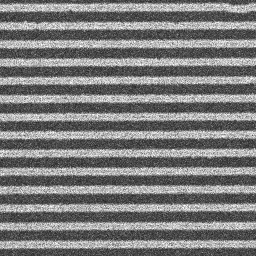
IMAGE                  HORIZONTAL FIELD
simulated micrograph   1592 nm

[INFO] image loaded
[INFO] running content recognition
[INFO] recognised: parallel lines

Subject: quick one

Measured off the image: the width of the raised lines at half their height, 39.7 nanometres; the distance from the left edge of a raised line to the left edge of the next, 0.113 µm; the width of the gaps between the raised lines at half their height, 0.0739 micrometres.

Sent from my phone